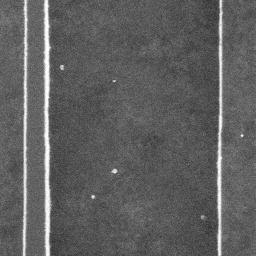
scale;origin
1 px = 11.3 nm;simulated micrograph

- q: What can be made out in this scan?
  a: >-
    lines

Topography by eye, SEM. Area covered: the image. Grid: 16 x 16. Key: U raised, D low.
UUUDDDDDDDDDDDUU
UUUDDDDDDDDDDDUU
UUUDDDDDDDDDDDUU
UUUDDDDDDDDDDDUU
UUUDDDDDDDDDDDUU
UUUDDDDDDDDDDDUU
UUUDDDDDDDDDDDUU
UUUDDDDDDDDDDDUU
UUUDDDDDDDDDDDUU
UUUDDDDDDDDDDDUU
UUUDDDDDDDDDDDUU
UUUDDDDDDDDDDDUU
UUUDDDDDDDDDDDUU
UUUDDDDDDDDDDDUU
UUUDDDDDDDDDDDUU
UUUDDDDDDDDDDDUU